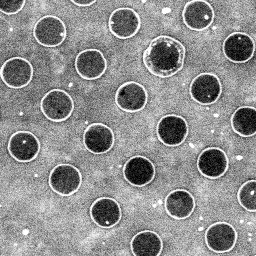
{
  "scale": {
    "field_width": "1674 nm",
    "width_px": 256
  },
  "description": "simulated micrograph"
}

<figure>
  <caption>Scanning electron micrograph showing a regular array of raised bodies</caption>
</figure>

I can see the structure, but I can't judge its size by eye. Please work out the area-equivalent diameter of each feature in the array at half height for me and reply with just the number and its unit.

0.201 µm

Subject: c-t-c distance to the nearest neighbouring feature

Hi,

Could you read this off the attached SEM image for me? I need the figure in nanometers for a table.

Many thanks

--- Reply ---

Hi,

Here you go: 342